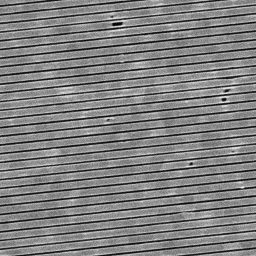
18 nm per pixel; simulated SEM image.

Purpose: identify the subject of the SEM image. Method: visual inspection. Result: parallel lines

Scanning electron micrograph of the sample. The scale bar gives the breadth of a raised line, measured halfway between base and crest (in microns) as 0.112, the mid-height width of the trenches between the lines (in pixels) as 2.36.